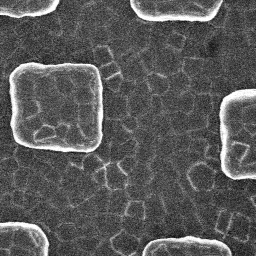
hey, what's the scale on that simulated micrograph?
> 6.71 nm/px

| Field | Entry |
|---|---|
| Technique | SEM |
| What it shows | raised bodies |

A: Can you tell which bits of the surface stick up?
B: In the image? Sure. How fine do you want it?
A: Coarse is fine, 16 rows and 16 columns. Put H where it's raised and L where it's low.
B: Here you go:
HHHLLLLLHHHHHHLL
LLLLLLLLLLLLLLLL
LLLLLLLLLLLLLLLL
LLLLLLLLLLLLLLLL
LHHHHHLLLLLLLLLL
LHHHHHLLLLLLLLLL
LHHHHHLLLLLLLLHH
LHHHHHLLLLLLLLHH
LHHHHHLLLLLLLLHH
LLLLLLLLLLLLLLHH
LLLLLLLLLLLLLLHH
LLLLLLLLLLLLLLLL
LLLLLLLLLLLLLLLL
LLLLLLLLLLLLLLLL
HHHLLLLLLLLLLLLL
HHHLLLLLLHHHHHLL